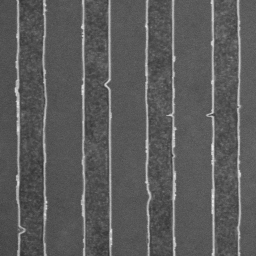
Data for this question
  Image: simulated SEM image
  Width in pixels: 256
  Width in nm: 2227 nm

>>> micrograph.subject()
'one or a few lines or trenches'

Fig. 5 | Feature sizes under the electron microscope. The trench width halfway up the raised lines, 223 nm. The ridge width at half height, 342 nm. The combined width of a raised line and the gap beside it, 563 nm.